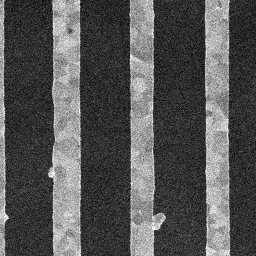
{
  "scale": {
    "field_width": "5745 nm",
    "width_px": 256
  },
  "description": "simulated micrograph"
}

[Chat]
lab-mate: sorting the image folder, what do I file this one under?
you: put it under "one or a few lines or trenches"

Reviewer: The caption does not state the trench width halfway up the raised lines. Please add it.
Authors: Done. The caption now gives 1140 nm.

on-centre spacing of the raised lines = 1690 nanometres